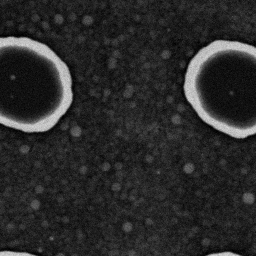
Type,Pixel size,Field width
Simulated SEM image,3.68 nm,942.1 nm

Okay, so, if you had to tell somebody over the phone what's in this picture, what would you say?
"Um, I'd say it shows raised bodies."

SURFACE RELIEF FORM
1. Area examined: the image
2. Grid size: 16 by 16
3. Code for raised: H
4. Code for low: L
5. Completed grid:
LLLLLLLLLLLLLLLL
LLLLLLLLLLLLLLLL
LLLLLLLLLLLLLLLL
HHHLLLLLLLLLLHHH
HHHHLLLLLLLLHHHH
HHHHLLLLLLLLHHHH
HHHHLLLLLLLLHHHH
HHHLLLLLLLLLLHHH
LLLLLLLLLLLLLLLL
LLLLLLLLLLLLLLLL
LLLLLLLLLLLLLLLL
LLLLLLLLLLLLLLLL
LLLLLLLLLLLLLLLL
LLLLLLLLLLLLLLLL
LLLLLLLLLLLLLLLL
LLLLLLLLLLLLLLLL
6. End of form